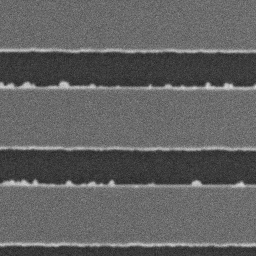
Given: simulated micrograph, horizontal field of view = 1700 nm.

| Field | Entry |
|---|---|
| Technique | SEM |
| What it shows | lines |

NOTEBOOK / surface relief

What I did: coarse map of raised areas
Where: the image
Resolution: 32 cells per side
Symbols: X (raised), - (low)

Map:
XXXXXXXXXXXXXXXXXXXXXXXXXXXXXXXX
XXXXXXXXXXXXXXXXXXXXXXXXXXXXXXXX
XXXXXXXXXXXXXXXXXXXXXXXXXXXXXXXX
XXXXXXXXXXXXXXXXXXXXXXXXXXXXXXXX
XXXXXXXXXXXXXXXXXXXXXXXXXXXXXXXX
XXXXXXXXXXXXXXXXXXXXXXXXXXXXXXXX
--------------------------------
--------------------------------
--------------------------------
--------------------------------
--------------------------------
XXXXXXXXXXXXXXXXXXXXXXXXXXXXXXXX
XXXXXXXXXXXXXXXXXXXXXXXXXXXXXXXX
XXXXXXXXXXXXXXXXXXXXXXXXXXXXXXXX
XXXXXXXXXXXXXXXXXXXXXXXXXXXXXXXX
XXXXXXXXXXXXXXXXXXXXXXXXXXXXXXXX
XXXXXXXXXXXXXXXXXXXXXXXXXXXXXXXX
XXXXXXXXXXXXXXXXXXXXXXXXXXXXXXXX
X-XXXXXXXXXXXXXXXXXXXXXXXXXXXXXX
--------------------------------
--------------------------------
--------------------------------
--------------------------------
XXXXXXXXXXXXXXXXXXXXXXXXXXXXXXXX
XXXXXXXXXXXXXXXXXXXXXXXXXXXXXXXX
XXXXXXXXXXXXXXXXXXXXXXXXXXXXXXXX
XXXXXXXXXXXXXXXXXXXXXXXXXXXXXXXX
XXXXXXXXXXXXXXXXXXXXXXXXXXXXXXXX
XXXXXXXXXXXXXXXXXXXXXXXXXXXXXXXX
XXXXXXXXXXXXXXXXXXXXXXXXXXXXXXXX
XXXXXXXXXXXXXXXXXXXXXXXXXXXXXXXX
--------------------------------